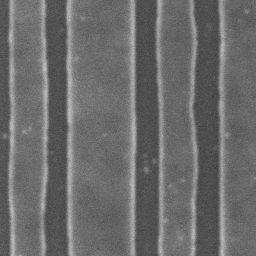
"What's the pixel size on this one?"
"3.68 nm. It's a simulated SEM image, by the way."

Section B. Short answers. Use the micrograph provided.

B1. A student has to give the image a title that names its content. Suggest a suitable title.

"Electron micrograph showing lines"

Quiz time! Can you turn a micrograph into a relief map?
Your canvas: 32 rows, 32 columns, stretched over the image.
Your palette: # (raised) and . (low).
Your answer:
.#####...########...####...#####
.#####..#########...####....####
.#####..#########...####....####
.#####...########...####....####
.#####...########...####....####
.#####...########...####....####
.#####...########...####....####
.#####..#########...####....####
.#####..#########...####....####
.#####...########...####...#####
.#####...########...####...#####
.#####...########...####....####
.#####...########...####...#####
.#####...########...####...#####
.#####...########...####....####
.#####...########...####....####
.#####...########...####....####
.#####...########...####....####
.#####...########...#####...####
.#####...########...#####...####
.#####...########...#####...####
.#####...########...#####...####
.#####...########...#####...####
.#####...########...####....####
.#####...########...####....####
.#####...########...####....####
.#####...########...####....####
.####....########...####....####
.####....########...####....####
.#####...########...####....####
.#####...########...####....####
.#####...########...####....####